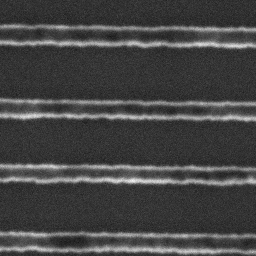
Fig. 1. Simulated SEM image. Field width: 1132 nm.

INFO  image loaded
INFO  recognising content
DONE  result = lines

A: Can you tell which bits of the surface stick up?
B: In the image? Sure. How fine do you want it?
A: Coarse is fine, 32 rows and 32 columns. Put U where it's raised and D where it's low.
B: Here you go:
DDDDDDDDDDDDDDDDDDDDDDDDDDDDDDDD
DDDDDDDDDDDDDDDDDDDDDDDDDDDDDDDD
DDDDDDDDDDDDDDDDDDDDDDDDDDDDDDDD
UUUUUUUUUUUUUUUUUUDDUUUUDDDDDDDD
UUUUUUUUUUUUUUUUUUUUUUUUUUUUUUUU
DDUDUDDUUUUDUUUUUUUUUUUUUUUUUUUU
DDDDDDDDDDDDDDDDDDDDDDDDDDDDDDDD
DDDDDDDDDDDDDDDDDDDDDDDDDDDDDDDD
DDDDDDDDDDDDDDDDDDDDDDDDDDDDDDDD
DDDDDDDDDDDDDDDDDDDDDDDDDDDDDDDD
DDDDDDDDDDDDDDDDDDDDDDDDDDDDDDDD
DDDDDDDDDDDDDDDDDDDDDDDDDDDDDDDD
UUDDDDDDDDDDDDDDDDDDDDDDDDDDDDDD
UUUUUUUUUUUUUUUUUUUUUUUUUUUUUUUU
UUUUUUUUUUUUUUUUUUUUUUUUUUUUUUUU
DDDDDDDDDDDDDDDDDDDDDDDDDDDDDDDD
DDDDDDDDDDDDDDDDDDDDDDDDDDDDDDDD
DDDDDDDDDDDDDDDDDDDDDDDDDDDDDDDD
DDDDDDDDDDDDDDDDDDDDDDDDDDDDDDDD
DDDDDDDDDDDDDDDDDDDDDDDDDDDDDDDD
DDDDDDDDDDDDDDDDDDDDDDDDDDDDDDDD
UUUUUUUUUUUUUUUUUUUUUUUUUUUUUUUU
UUUUUUUUUUDUUUUUUUUUUUUUUUUUUUUU
DDDDDDDDDDDDDDDDDDDDDDDDDDDDDDDD
DDDDDDDDDDDDDDDDDDDDDDDDDDDDDDDD
DDDDDDDDDDDDDDDDDDDDDDDDDDDDDDDD
DDDDDDDDDDDDDDDDDDDDDDDDDDDDDDDD
DDDDDDDDDDDDDDDDDDDDDDDDDDDDDDDD
DDDDDDDDDDDDDDDDDDDDDDDDDDDDDDDD
UUUUUUUUUUUUUUUUUUUUUUUUUUUUUUUU
UUUUUUUUUUUUUUUUUUUUUUUUUUUUUUUU
DDDDDDDDDDDDDDDDDDDDDDUUUUUUUDUU